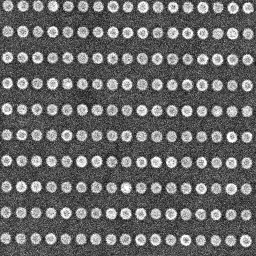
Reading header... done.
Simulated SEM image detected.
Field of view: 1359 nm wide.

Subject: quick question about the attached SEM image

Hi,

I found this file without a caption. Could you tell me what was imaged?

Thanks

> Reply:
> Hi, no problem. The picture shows a regular array of raised bodies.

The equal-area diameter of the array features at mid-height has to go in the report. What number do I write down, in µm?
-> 0.0542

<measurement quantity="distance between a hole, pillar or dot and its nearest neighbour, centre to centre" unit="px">14.9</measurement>